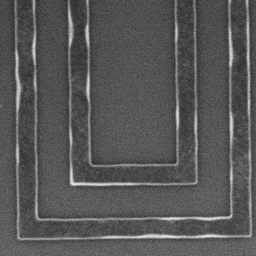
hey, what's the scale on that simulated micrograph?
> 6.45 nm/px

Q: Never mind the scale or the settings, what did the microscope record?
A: groups of lines, slits or small figures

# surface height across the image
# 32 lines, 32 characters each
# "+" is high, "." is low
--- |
..++.....++...........++.....++.
..++.....++...........++.....++.
..++.....++...........++.....++.
..++.....++...........++.....++.
..++.....++...........++.....++.
..++.....++...........++.....++.
..++.....++...........++.....++.
..++.....++...........++.....++.
..++.....++...........++.....++.
..++.....++...........++.....++.
..++.....++...........++.....++.
..++.....++...........++.....++.
..++.....++...........+++....++.
..++.....++...........+++....++.
..+++....++...........++.....++.
..+++....++...........++.....++.
..++.....++...........++.....++.
..++.....++...........+++....++.
..++.....++...........+++....++.
..+++....++...........+++....++.
..+++....+++..........+++....++.
..+++....++++++++++++++++....++.
..+++....++++++++++++++++....++.
..+++........................++.
..+++........................++.
..+++........................++.
..+++........................++.
..+++++++++++++++++++++++++++++.
..+++++++++++++++++++++++++++++.
..+++++++++++++++++++++++++++++.
................................
................................